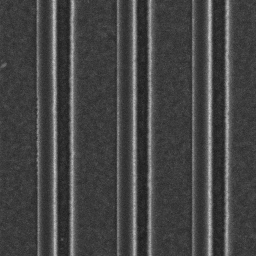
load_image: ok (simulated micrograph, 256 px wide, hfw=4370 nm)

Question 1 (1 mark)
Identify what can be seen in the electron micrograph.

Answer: lines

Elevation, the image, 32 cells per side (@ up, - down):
@@@@@@@--@@@@@@@@--@@@@@@@--@@@@
@@@@@@@--@@@@@@@@--@@@@@@@--@@@@
@@@@@@@--@@@@@@@@--@@@@@@@--@@@@
@@@@@@@--@@@@@@@@--@@@@@@@--@@@@
@@@@@@@--@@@@@@@@--@@@@@@@--@@@@
@@@@@@@--@@@@@@@@--@@@@@@@--@@@@
@@@@@@@--@@@@@@@@--@@@@@@@--@@@@
@@@@@@@--@@@@@@@@--@@@@@@@--@@@@
@@@@@@@--@@@@@@@@--@@@@@@@--@@@@
@@@@@@@--@@@@@@@@--@@@@@@@--@@@@
@@@@@@@--@@@@@@@@--@@@@@@@--@@@@
@@@@@@@--@@@@@@@@--@@@@@@@--@@@@
@@@@@@@--@@@@@@@@--@@@@@@@--@@@@
@@@@@@@--@@@@@@@@--@@@@@@@--@@@@
@@@@@@@--@@@@@@@@--@@@@@@@--@@@@
@@@@@@@--@@@@@@@@--@@@@@@@--@@@@
@@@@@@@--@@@@@@@@--@@@@@@@--@@@@
@@@@@@@--@@@@@@@@--@@@@@@@--@@@@
@@@@@@@--@@@@@@@@--@@@@@@@--@@@@
@@@@@@@--@@@@@@@@--@@@@@@@--@@@@
@@@@@@@--@@@@@@@@--@@@@@@@--@@@@
@@@@@@@--@@@@@@@@--@@@@@@@--@@@@
@@@@@@@--@@@@@@@@--@@@@@@@--@@@@
@@@@@@@--@@@@@@@@--@@@@@@@--@@@@
@@@@@@@--@@@@@@@@--@@@@@@@--@@@@
@@@@@@@--@@@@@@@@--@@@@@@@--@@@@
@@@@@@@--@@@@@@@@--@@@@@@@--@@@@
@@@@@@@--@@@@@@@@--@@@@@@@--@@@@
@@@@@@@--@@@@@@@@--@@@@@@@--@@@@
@@@@@@@--@@@@@@@@--@@@@@@@--@@@@
@@@@@@@--@@@@@@@@--@@@@@@@--@@@@
@@@@@@@--@@@@@@@@--@@@@@@@--@@@@